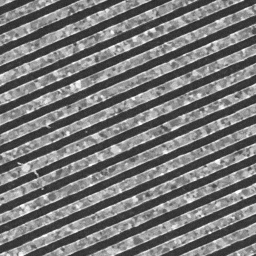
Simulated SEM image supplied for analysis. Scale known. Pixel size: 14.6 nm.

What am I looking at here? parallel lines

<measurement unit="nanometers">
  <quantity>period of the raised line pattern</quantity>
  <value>266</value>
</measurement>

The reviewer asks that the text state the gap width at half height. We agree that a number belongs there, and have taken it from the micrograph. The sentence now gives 128 nanometres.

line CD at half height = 142 nanometers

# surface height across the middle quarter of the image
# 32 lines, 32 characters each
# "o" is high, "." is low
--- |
.ooooo.......ooooo......oooooo..
oooo......oooooo......ooooo.....
oo......oooooo.....oooooo......o
......ooooo......ooooo......oooo
...oooooo......ooooo......oooooo
.oooooo.....oooooo......oooooo..
oooo......oooooo.....oooooo.....
oo......ooooo......oooooo.....oo
......ooooo......oooooo.....oooo
...oooooo.....oooooo......oooooo
.oooooo.....oooooo......ooooo...
oooo......oooooo......oooooo....
oo......ooooo......oooooo.....oo
......ooooo......ooooo......oooo
...ooooo.......ooooo......oooooo
.ooooo......oooooo......ooooo...
oooo......ooooo......oooooo.....
oo......oooooo.....oooooo......o
.....oooooo......oooooo.....oooo
...oooooo......ooooo......oooooo
.ooooo......oooooo......ooooo...
oooo......oooooo.....oooooo.....
oo......ooooo......oooooo......o
.....oooooo......oooooo.....oooo
...oooooo......ooooo......oooooo
.ooooo......oooooo.....oooooo...
oooo......ooooo......oooooo.....
oo......ooooo......oooooo.....oo
.....oooooo......oooooo.....oooo
...ooooo......oooooo......ooooo.
.ooooo......oooooo......ooooo...
oooo......oooooo.....oooooo.....